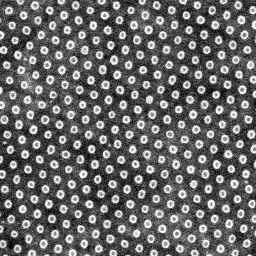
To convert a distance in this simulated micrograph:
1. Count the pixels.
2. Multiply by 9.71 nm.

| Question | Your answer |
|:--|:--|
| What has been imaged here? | a regular array of raised bodies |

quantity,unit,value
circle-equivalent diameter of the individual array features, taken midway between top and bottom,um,0.0648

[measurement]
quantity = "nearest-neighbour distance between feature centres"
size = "145 nanometres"